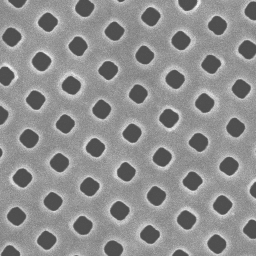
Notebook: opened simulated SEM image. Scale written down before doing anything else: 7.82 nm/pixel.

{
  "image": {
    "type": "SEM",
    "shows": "a regular array of holes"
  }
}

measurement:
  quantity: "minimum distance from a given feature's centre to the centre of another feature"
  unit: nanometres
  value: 301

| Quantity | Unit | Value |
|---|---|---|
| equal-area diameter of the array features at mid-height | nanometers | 143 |